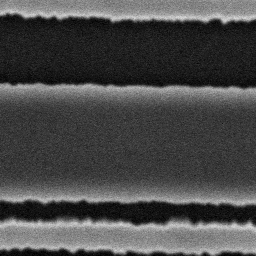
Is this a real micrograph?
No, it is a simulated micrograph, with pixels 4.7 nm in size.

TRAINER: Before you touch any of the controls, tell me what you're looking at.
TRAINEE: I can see lines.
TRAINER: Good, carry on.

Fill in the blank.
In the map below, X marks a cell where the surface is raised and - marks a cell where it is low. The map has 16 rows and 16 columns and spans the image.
XXXXXXXXXXXXXXXX
----------------
----------------
----------------
----------------
XXXXXXXXXXXXX---
XXXXXXXXXXXXXXXX
XXXXXXXXXXXXXXXX
XXXXXXXXXXXXXXXX
XXXXXXXXXXXXXXXX
XXXXXXXXXXXXXXXX
XXXXXXXXXXXXXXXX
XXXXXXXXXXXXXXXX
XXXXXXXXXXXXXXXX
XXXXXXXXXXXXXXXX
X--XXXXXXXXXXXXX